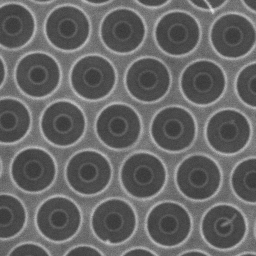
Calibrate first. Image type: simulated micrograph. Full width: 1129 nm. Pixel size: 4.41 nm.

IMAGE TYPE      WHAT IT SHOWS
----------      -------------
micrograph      an array of small figures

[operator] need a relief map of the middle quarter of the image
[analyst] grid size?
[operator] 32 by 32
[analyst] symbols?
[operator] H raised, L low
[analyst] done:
HHLLLLLLLLLLHHHHHLLLLLLLLHHHHHHL
HHLLLLHHHLLLLHHHLLLLLLLLLLHHHHLL
HHLLLHHHHLLLLHHHLLLHHHHLLLHHHHLL
HHLLLHHHHLLLLHHLLLLHHHHLLLLHHLLL
HHLLLHHHHLLLLHHLLLLHHHHLLLLHHLLL
HHLLLLLHLLLLHHHHLLLHHHHLLLHHHLLL
HHHLLLLLLLLLHHHHLLLLLLLLLLHHHLLL
HHHLLLLLLLLHHHHHHLLLLLLLLHHHHHLL
HHHHHLLLLLHHHHHHHHLLLLLLHHHHHHHL
LHHHHHHHHHHHHHHHHHHHLLHHHHHHHHHH
LLLHHHHHHHHLLLLLHHHHHHHHHHHHHHHH
LLLLHHHHHHLLLLLLLHHHHHHHLLLLLLLH
LLLLLHHHHLLLLLLLLLHHHHHLLLLLLLLL
HLLLLHHHLLLLLHHLLLLHHHHLLLLLLLLL
HHLLLHHHLLLHHHHLLLLHHHLLLLHHHLLL
HHLLLHHHLLLHHHHHLLLHHHLLLHHHHHLL
HLLLLHHHLLLHHHHHLLLHHHLLLHHHHHLL
LLLLLHHHLLLLHHHLLLLHHHLLLHHHHLLL
LLLLHHHHHLLLLLLLLLLHHHLLLLLLLLLL
LLLHHHHHHHLLLLLLLLHHHHHLLLLLLLLL
LHHHHHHHHHHLLLLLLHHHHHHHLLLLLLLH
HHHHHHHHHHHHHHHHHHHHHHHHHLLLLLHH
HHHLLLLLLHHHHHHHHLLLLLHHHHHHHHHH
HHLLLLLLLLHHHHHHLLLLLLLHHHHHHHHL
HLLLLLLLLLLHHHHLLLLLLLLLHHHHHLLL
HLLLHHHHLLLLHHHLLLLLLLLLLHHHHLLL
LLLLHHHHLLLLHHLLLLHHHHLLLHHHLLLL
LLLLHHHHLLLLHHLLLLHHHHLLLHHHLLLH
HLLLHHHHLLLLHHLLLLHHHHLLLLHHLLLH
HLLLLLLLLLLHHHLLLLHHHHLLLHHHLLLL
HHLLLLLLLLLHHHHLLLLLLLLLLHHHLLLL
HHHLLLLLLLHHHHHLLLLLLLLLHHHHHLLL